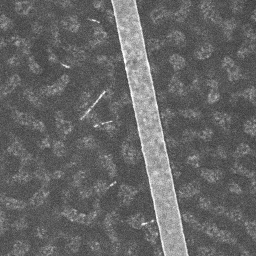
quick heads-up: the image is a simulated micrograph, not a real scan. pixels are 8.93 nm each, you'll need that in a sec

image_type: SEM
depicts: one or a few lines or trenches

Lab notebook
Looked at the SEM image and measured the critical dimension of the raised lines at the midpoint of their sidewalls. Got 209 nanometres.